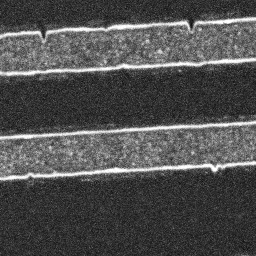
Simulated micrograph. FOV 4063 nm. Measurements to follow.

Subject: one or a few lines or trenches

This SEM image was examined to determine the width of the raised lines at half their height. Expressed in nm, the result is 654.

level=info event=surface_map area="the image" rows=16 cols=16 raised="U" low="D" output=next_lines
DDDDDDDDDDDDDDDD
DDDDDDDDDDUDUUUU
UUUUUUUUUUUUUUUU
UUUUUUUUUUUUUUUU
UUUDDDDDDDDDDDDD
DDDDDDDDDDDDDDDD
DDDDDDDDDDDDDDDD
DDDDDDDDDDDDDDDD
DUUUUUUUUUUUUUUU
UUUUUUUUUUUUUUUU
UUUUUUUUUUUDDDDD
DDDDDDDDDDDDDDDD
DDDDDDDDDDDDDDDD
DDDDDDDDDDDDDDDD
DDDDDDDDDDDDDDDD
DDDDDDDDDDDDDDDD